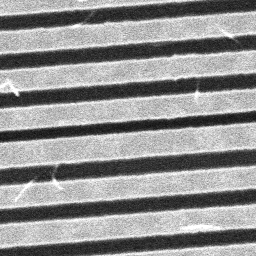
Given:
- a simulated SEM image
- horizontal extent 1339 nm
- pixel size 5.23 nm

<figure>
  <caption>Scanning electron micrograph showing parallel lines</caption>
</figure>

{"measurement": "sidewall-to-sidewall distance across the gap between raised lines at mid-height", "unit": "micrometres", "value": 0.0743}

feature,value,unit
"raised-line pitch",202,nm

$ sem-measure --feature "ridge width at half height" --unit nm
130